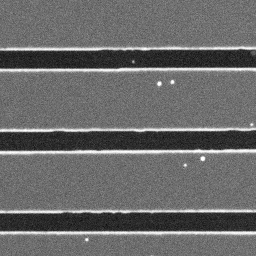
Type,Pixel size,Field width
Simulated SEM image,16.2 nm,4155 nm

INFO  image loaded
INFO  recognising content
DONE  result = lines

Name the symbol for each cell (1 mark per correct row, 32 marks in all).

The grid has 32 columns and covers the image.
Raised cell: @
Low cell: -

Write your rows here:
@@@@@@@@@@@@@@@@@@@@@@@@@@@@@@@@
@@@@@@@@@@@@@@@@@@@@@@@@@@@@@@@@
@@@@@@@@@@@@@@@@@@@@@@@@@@@@@@@@
@@@@@@@@@@@@@@@@@@@@@@@@@@@@@@@@
@@@@@@@@@@@@@@@@@@@@@@@@@@@@@@@@
@@@@@@@@@@@@@@@@@@@@@@@@@@@@@@@@
--------------------------------
--------------------------------
--------------------------------
@@@@@@@@@@@@@@@@@@@@@@@@@@@@@@@@
@@@@@@@@@@@@@@@@@@@@@@@@@@@@@@@@
@@@@@@@@@@@@@@@@@@@@@@@@@@@@@@@@
@@@@@@@@@@@@@@@@@@@@@@@@@@@@@@@@
@@@@@@@@@@@@@@@@@@@@@@@@@@@@@@@@
@@@@@@@@@@@@@@@@@@@@@@@@@@@@@@@@
@@@@@@@@@@@@@@@@@@@@@@@@@@@@@@@@
--------------------------------
--------------------------------
--------------------------------
@@@@@@@@@@@@@@@@@@@@@@@@@@@@@@@@
@@@@@@@@@@@@@@@@@@@@@@@@@@@@@@@@
@@@@@@@@@@@@@@@@@@@@@@@@@@@@@@@@
@@@@@@@@@@@@@@@@@@@@@@@@@@@@@@@@
@@@@@@@@@@@@@@@@@@@@@@@@@@@@@@@@
@@@@@@@@@@@@@@@@@@@@@@@@@@@@@@@@
@@@@@@@@@@@@@@@@@@@@@@@@@@@@@@@@
@@@@@@@@-@@@@-@@----------------
--------------------------------
--------------------------------
@@@@@@@@@@@@@@@@@@@@@@@@@@@@@@@@
@@@@@@@@@@@@@@@@@@@@@@@@@@@@@@@@
@@@@@@@@@@@@@@@@@@@@@@@@@@@@@@@@